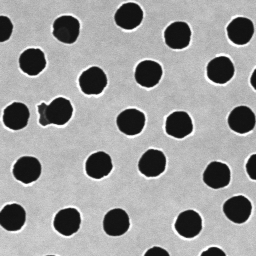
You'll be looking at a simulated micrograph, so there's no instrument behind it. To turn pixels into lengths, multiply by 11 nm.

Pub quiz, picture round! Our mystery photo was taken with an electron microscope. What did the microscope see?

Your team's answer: a regular array of holes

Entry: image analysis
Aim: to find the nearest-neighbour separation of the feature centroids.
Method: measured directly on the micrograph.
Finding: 47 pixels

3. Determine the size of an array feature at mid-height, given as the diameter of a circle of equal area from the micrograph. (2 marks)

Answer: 308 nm